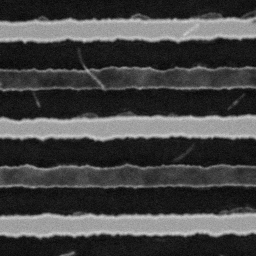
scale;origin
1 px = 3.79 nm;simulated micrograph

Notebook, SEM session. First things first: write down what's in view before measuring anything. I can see lines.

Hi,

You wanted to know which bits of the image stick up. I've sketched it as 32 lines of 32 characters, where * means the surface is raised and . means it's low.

................................
................................
........*..*.*****...*.***.*****
********************************
********************************
................................
................................
................................
.............****.*...*.**..*.**
********************************
********************************
................................
................................
................................
..............................**
********************************
********************************
................................
................................
................................
................................
********************************
********************************
................................
................................
................................
................................
********************************
********************************
.**.**..........................
................................
................................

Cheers